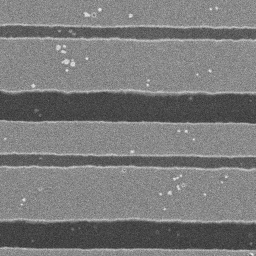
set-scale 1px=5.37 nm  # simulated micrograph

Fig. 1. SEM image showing lines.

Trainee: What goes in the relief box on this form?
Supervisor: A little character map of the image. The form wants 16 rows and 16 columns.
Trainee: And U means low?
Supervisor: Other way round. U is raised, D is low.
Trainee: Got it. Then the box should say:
UUUUUUUUUUUUUUUU
UUUUUUUUUUUUUUUU
UUUUUUUUUUUUUUUU
UUUUUUUUUUUUUUUU
UUUUUUUUUUUUUUUU
UUUUUUUUUUUUUUUU
DDDDDDDDDDDDDDDD
DDDDDDDDDDDDDDDD
UUUUUUUUUUUUUUUU
UUUUUUUUUUUUUUUU
UUUUUUUUUUUUUUUU
UUUUUUUUUUUUUUUU
UUUUUUUUUUUUUUUU
UUUUUUUUUUUUUUUU
DDDDDDDDDDDDDDDD
UDDDDDDDDDDDDDDD